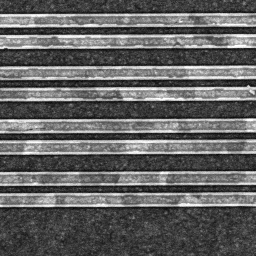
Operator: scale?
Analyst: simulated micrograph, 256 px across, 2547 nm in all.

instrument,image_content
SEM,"parallel lines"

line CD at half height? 12.1 pixels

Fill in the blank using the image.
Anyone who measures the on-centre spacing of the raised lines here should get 25.6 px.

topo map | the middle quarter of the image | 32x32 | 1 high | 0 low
00000000000000000000000000000000
11111111111111111111111111111111
11111111111111111111111111111111
11111111111111111111111111111111
00000000000000000000000000000000
00000000000000000000000000000000
11111111111111111111111111111111
11111111111111111111111111111111
11111111111111111111111111111111
00000000000000000000000000000000
00000000000000000000000000000000
00000000000000000000000000000000
00000000000000000000000000000000
00000000000000000000000000000000
11111111111111111111111111111111
11111111111111111111111111111111
11111111111111111111111111111111
00000000000000000000000000000000
00000000000000000000000000000000
11111111111111111111101111111111
11111111111111111111111111111111
11111111111111111111111111111111
00000000000000000000000000000000
00000000000000000000000000000000
00000000000000000000000000000000
00000000000000000000000000000000
00000000000000000000000000000000
11111111111111111111111111111111
11111111111111111111111111111111
11111111111111111111111111111111
00000000000000000000000000000000
00000000000000000000000000000000